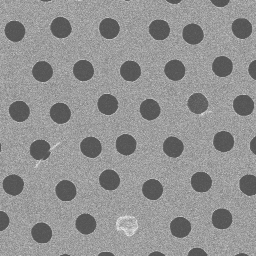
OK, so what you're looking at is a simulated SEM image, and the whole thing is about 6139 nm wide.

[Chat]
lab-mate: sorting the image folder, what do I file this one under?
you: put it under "a regular array of holes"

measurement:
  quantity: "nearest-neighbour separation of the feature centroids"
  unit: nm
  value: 993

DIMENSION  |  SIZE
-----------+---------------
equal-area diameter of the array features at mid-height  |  507 nm